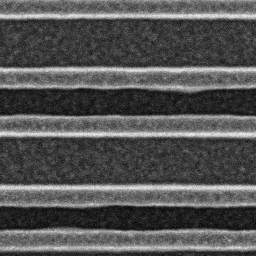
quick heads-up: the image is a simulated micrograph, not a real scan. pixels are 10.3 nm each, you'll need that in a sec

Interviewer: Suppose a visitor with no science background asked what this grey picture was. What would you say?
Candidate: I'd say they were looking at lines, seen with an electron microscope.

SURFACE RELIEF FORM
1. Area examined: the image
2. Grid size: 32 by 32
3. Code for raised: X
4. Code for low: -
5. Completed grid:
XXXXXXXXXXXXXXXXXXXXXXXXXXXXXXXX
XXXXXXXXXXXXXXXXXXXXXXXXXXXXXXXX
--------------------------------
--------------------------------
--------------------------------
--------------------------------
--------------------------------
--------------------------------
--------------------------------
XXXXXXXXXXXXXXXXXXXXXXXXXXXXXXXX
XXXXXXXXXXXXXXXXXXXXXXXXXXXXXXXX
--------------------------------
--------------------------------
--------------------------------
--------------------------------
XXXXXXXXXXXXXXXXXXXXXXXXXXXXXXXX
XXXXXXXXXXXXXXXXXXXXXXXXXXXXXXXX
--------------------------------
--------------------------------
--------------------------------
--------------------------------
--------------------------------
--------------------------------
--------------------------------
XXXXXXXXXXXXXXXXXXXXXXXXXXXXXXXX
XXXXXXXXXXXXX--XXXXXXXXXXXXXXXXX
--------------------------------
--------------------------------
--------------------------------
XXXXXXXXXXXXXXXXXXXXXXXXXXXXXXXX
XXXXXXXXXXXXXXXXXXXXXXXXXXXXXXXX
--------------------------------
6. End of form